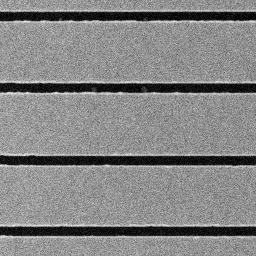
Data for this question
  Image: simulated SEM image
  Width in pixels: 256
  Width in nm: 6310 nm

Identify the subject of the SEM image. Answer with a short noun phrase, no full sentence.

lines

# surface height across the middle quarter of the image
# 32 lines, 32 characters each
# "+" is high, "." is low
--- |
++++++++++++++++++++++++++++++++
++++++++++++++++++++++++++++++++
++++++++++++++++++++++++++++++++
++++++++++++++++++++++++++++++++
++++++++++++++++++++++++++++++++
................................
................................
++++++++++++++++++++++++++++++++
++++++++++++++++++++++++++++++++
++++++++++++++++++++++++++++++++
++++++++++++++++++++++++++++++++
++++++++++++++++++++++++++++++++
++++++++++++++++++++++++++++++++
++++++++++++++++++++++++++++++++
++++++++++++++++++++++++++++++++
++++++++++++++++++++++++++++++++
++++++++++++++++++++++++++++++++
++++++++++++++++++++++++++++++++
++++++++++++++++++++++++++++++++
++++++++++++++++++++++++++++++++
++++++++++++++++++++++++++++++++
++++++++++++++++++++++++++++++++
++++++++++++++++++++++++++++++++
................................
................................
..+....+..++....................
++++++++++++++++++++++++++++++++
++++++++++++++++++++++++++++++++
++++++++++++++++++++++++++++++++
++++++++++++++++++++++++++++++++
++++++++++++++++++++++++++++++++
++++++++++++++++++++++++++++++++